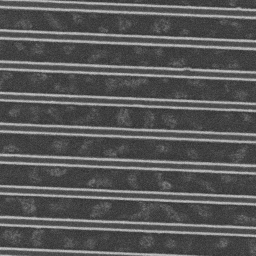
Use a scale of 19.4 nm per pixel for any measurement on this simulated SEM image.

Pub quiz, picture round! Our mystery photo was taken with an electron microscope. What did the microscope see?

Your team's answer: parallel lines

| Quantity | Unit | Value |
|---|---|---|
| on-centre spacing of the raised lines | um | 0.602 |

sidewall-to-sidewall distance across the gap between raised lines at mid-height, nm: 444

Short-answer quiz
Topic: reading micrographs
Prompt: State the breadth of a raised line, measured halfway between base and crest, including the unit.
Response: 167 nm